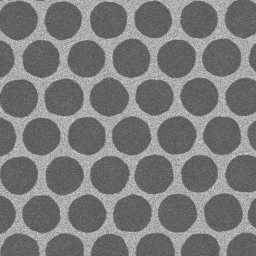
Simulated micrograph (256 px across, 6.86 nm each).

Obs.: a regular array of holes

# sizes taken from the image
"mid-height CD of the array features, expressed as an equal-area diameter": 0.263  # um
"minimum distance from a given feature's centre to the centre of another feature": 0.305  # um